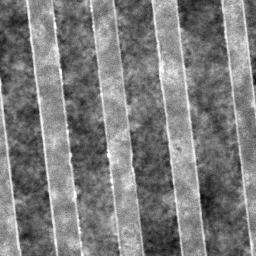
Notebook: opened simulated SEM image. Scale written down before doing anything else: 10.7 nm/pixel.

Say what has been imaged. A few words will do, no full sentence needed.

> one or a few lines or trenches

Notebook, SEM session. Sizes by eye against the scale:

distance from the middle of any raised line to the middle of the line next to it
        668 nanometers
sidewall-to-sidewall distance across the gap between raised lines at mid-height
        38.1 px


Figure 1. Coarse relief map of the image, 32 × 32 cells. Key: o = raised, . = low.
...oooo....ooo.....o.o......oo..
....ooo....ooo.....ooo......ooo.
....ooo.....oo.....ooo......ooo.
....ooo.....ooo....ooo......ooo.
....ooo.....ooo.....ooo.....ooo.
....ooo.....ooo.....ooo.....ooo.
....ooo.....ooo.....ooo......oo.
....oo......ooo.....ooo......oo.
....ooo.....ooo......oo......oo.
.....ooo....ooo.....ooo......oo.
.....ooo.....oo.....ooo......ooo
.....ooo.....ooo....ooo......ooo
.....ooo.....ooo.....oo......ooo
.....ooo.....ooo.....ooo.....ooo
.....ooo.....ooo.....ooo.....ooo
o....ooo.....ooo.....ooo......oo
o....ooo.....ooo.....ooo......oo
o....oooo....ooo.....ooo......oo
o.....ooo.....oo.......o......oo
o.....ooo.....oo.....o.o......oo
o.....ooo.....oo.....ooo......oo
o.....ooo.....ooo.....ooo.....oo
o.....ooo.....ooo.....ooo.....oo
o.....ooo.....ooo.....ooo......o
oo....ooo.....ooo.....ooo......o
oo....oooo....ooo.....ooo......o
oo.....ooo....ooo.....ooo......o
oo.....ooo.....oo.....ooo......o
oo.....ooo.....ooo....ooo......o
oo.....ooo.....ooo.....oo......o
oo.....ooo.....ooo.....ooo.....o
ooo....ooo.....ooo.....ooo......